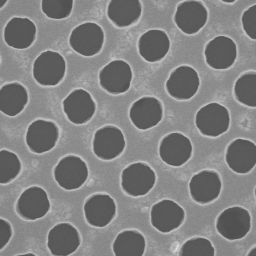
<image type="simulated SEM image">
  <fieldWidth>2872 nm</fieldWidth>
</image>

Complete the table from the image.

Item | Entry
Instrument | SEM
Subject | a regular array of holes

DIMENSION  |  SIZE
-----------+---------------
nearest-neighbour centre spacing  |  0.524 um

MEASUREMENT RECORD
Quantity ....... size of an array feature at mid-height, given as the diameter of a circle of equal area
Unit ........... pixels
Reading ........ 32.5